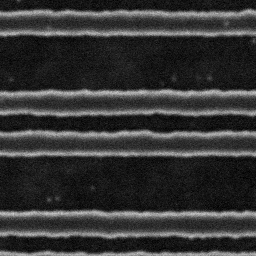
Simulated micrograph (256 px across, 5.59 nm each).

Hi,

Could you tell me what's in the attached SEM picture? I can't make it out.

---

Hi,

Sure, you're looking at lines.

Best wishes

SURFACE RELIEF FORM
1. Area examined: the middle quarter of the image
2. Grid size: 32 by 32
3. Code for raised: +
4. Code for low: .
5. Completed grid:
................................
................................
................................
................................
................................
................................
................................
++++++++++++++++++++++++++++++++
++++++++++++++++++++++++++++++++
++++++++++++++++++++++++++++++++
++++++++++++++++++++++++++++++++
++++++++++++++++++++++++++++++++
++++++++++++.+...............+++
................................
................................
................................
................................
++++.++++++.+++++++++++...++++++
++++++++++++++++++++++++++++++++
++++++++++++++++++++++++++++++++
++++++++++++++++++++++++++++++++
++++++++++++++++++++++++++++++++
+++++++++++++++++++++++.++++++++
................................
................................
................................
................................
................................
................................
................................
................................
................................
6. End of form